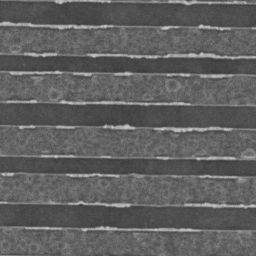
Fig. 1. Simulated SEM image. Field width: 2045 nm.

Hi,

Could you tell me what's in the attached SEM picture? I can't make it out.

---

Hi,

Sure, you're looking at parallel lines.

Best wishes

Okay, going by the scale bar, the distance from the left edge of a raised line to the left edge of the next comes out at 396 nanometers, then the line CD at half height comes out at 245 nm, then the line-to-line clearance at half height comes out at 0.178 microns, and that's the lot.